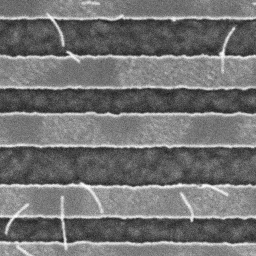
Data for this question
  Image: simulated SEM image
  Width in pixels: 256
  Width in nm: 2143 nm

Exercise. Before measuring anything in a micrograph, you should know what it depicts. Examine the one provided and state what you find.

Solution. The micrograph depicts lines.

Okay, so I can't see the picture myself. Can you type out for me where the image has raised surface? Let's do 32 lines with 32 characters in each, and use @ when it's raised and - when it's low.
@@@@@@@@@@@@@@@@@@@@@@@@@@@@@@@@
@@@@@@@@@@@@@@@@@@@@@@@@@@@@@@@@
--------------------------------
--------------------------------
--------------------------------
--------------------------------
--------------------------------
@@@@@@@@@@@@@@@@@@@@@@@@@@@@@@@@
@@@@@@@@@@@@@@@@@@@@@@@@@@@@@@@@
@@@@@@@@@@@@@@@@@@@@@@@@@@@@@@@@
@@@@@@@@@@@@@@@@@@@@@@@@@@@@@@@@
--------------------------------
--------------------------------
--------------------------------
@@@@@@@@@@@@@@@@@@@@@@@@@@@@@@@@
@@@@@@@@@@@@@@@@@@@@@@@@@@@@@@@@
@@@@@@@@@@@@@@@@@@@@@@@@@@@@@@@@
@@@@@@@@@@@@@@@@@@@@@@@@@@@@@@@@
--------------------------------
--------------------------------
--------------------------------
--------------------------------
--------------------------------
@@@@@@@@@@@@@@@@@@@@@@@@@@@@@@@@
@@@@@@@@@@@@@@@@@@@@@@@@@@@@@@@@
@@@@@@@@@@@@@@@@@@@@@@@@@@@@@@@@
@@@@@@@@@@@@@@@@@@@@@@@@@@@@@@@@
--------------------------------
--------------------------------
--------------------------------
@@@@@@@@@@@@@@@@@@@@@@@@@@@@@@@@
@@@@@@@@@@@@@@@@@@@@@@@@@@@@@@@@